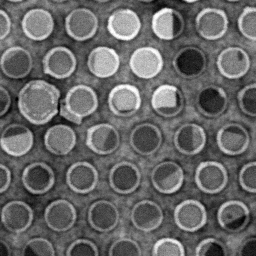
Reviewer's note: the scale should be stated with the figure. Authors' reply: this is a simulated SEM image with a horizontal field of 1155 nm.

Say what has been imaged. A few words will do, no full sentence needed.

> a regular array of raised bodies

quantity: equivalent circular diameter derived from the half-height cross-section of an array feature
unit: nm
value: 137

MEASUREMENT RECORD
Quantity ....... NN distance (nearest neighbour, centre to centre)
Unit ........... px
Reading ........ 43